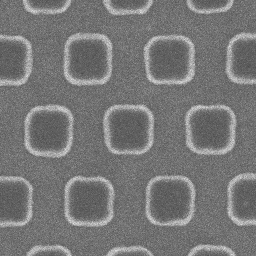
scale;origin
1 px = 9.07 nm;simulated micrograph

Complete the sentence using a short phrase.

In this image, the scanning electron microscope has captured raised bodies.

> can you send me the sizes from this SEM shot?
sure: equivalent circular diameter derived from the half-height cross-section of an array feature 456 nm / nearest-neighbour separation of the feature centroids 731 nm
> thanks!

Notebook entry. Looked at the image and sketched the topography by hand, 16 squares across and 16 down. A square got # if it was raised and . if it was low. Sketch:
..##...##...##..
................
#....##...##...#
##..###..###..##
##..###..###..##
................
................
..##...##...###.
..##...##...###.
..##...##....#..
................
##..###..###..##
##..###..###..##
##..###..###...#
................
..##....#...##..